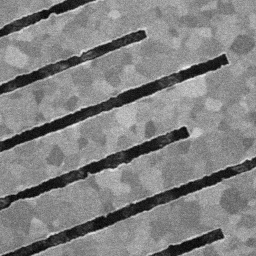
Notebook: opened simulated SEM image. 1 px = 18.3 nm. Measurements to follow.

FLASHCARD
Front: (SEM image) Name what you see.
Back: parallel lines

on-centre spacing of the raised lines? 0.98 micrometres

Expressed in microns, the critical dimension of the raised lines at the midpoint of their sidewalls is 0.768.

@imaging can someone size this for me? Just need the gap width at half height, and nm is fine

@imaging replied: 211